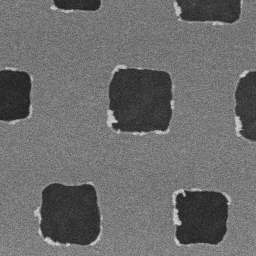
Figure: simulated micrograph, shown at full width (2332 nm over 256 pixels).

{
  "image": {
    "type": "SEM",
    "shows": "holes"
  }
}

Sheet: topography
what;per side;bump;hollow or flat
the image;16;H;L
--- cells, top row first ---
HHHHLLHHHHHLLLLH
HHHHHHHHHHHHHHHH
HHHHHHHHHHHHHHHH
HHHHHHHHHHHHHHHH
LHHHHHHLLLHHHHHH
LLHHHHHLLLLHHHHL
LLHHHHHLLLLHHHHL
LHHHHHHLLLLHHHHL
HHHHHHHHHHHHHHHL
HHHHHHHHHHHHHHHH
HHHHHHHHHHHHHHHH
HHHLHHHHHHHHHHHH
HHHLLLHHHHHLLLHH
HHHLLLHHHHHLLLHH
HHHLLLHHHHHLLLHH
HHHHHHHHHHHHHHHH